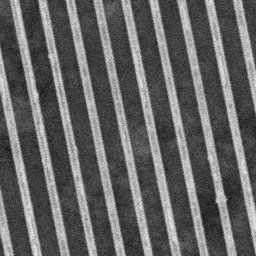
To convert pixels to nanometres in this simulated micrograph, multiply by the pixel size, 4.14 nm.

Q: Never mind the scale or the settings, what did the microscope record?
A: parallel lines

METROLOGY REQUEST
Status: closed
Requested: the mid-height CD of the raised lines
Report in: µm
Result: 0.0294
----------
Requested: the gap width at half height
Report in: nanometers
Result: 84.7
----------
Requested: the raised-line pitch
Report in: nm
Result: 113